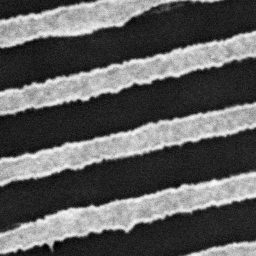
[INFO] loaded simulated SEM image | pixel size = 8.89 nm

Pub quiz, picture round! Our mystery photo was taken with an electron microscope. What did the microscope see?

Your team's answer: one or a few lines or trenches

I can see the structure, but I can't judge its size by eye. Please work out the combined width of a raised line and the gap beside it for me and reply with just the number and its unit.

599 nm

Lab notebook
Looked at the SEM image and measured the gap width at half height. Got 0.406 micrometres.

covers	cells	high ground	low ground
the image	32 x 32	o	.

............oooooooo............
.......oooooooooo...............
..oooooooooooooo................
oooooooooooo....................
oooo..........................oo
oo........................oooooo
......................oooooooooo
...................ooooooooo....
..............oooooooooo........
..........ooooooooooo...........
......oooooooooo................
.oooooooooooo...................
oooooooo........................
ooo...........................oo
.........................ooooooo
....................oooooooooooo
.................oooooooooooo...
............ooooooooooo.........
........ooooooooooo.............
...ooooooooooo..................
ooooooooooo.....................
oooooo..........................
o............................ooo
.......................ooooooooo
...................ooooooooooooo
..............oooooooooooo......
........oooooooooooooo..........
......ooooooooooooo.............
...oooooooooo..o................
oooooooo........................
oooo............................
..........................oooooo